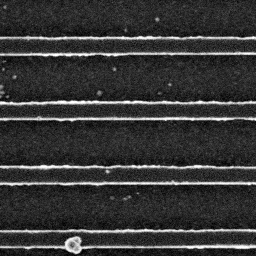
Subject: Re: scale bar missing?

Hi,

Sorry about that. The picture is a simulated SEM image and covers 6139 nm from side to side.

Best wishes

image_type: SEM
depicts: lines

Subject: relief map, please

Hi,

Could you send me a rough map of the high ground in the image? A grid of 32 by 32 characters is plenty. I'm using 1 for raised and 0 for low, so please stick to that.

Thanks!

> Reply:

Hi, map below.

00000000000000000000000000000000
00000000000000000000000000000000
00000000000000000000000000000000
00000000000000000000000000000000
00000000000000000000000000000000
11111111111111111111111111111111
11111111111111111111111111111111
00000000000000000000000000000000
00000000000000000000000000000000
00000000000000000000000000000000
00000000000000000000000000000000
00000000000000000000000000000000
00000000000000000000000000000000
11111111111111111111111111111111
11111111111111111111111111111111
00000000000000000000000000000000
00000000000000000000000000000000
00000000000000000000000000000000
00000000000000000000000000000000
00000000000000000000000000000000
00000000000000000000000000000000
11111111111111111111111111111111
11111111111111111111111111111111
00000000000000000000000000000000
00000000000000000000000000000000
00000000000000000000000000000000
00000000000000000000000000000000
00000000000000000000000000000000
00000000000000000000000000000000
11111111111111111111111111111111
11111111111111111111111111111111
00000000010000000000000000000000